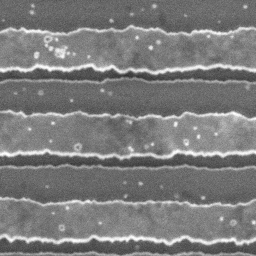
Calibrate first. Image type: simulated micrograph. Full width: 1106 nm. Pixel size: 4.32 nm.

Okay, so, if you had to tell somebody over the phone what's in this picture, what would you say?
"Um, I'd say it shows lines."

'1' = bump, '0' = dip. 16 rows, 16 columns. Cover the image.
0000000000000000
0000000000000000
1111111111111111
1111111111111111
0000000001000000
0000000000000000
0000000000000000
1111111111111111
1111111111111111
1111111111111111
0000000000000000
0000000000000000
1100000000000000
1111111111111111
1111111111111111
0000000000000000